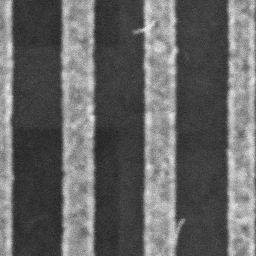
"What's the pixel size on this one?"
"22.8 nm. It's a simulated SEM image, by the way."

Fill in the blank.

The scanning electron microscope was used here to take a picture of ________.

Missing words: one or a few lines or trenches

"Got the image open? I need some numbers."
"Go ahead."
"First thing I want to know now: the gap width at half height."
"1.31 microns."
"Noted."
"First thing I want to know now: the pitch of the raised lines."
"1.86 um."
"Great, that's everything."